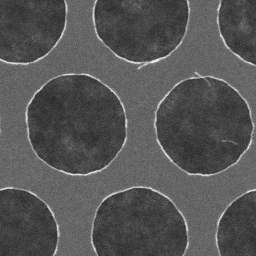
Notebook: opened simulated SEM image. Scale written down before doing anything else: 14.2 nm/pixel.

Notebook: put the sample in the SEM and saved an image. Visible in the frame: holes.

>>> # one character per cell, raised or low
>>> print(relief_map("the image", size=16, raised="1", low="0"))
0000110000001100
0000110000001100
0000110000011100
0001111000111110
1111111111111111
1110000111100001
1100000011000001
1100000011000000
1100000011000000
1100000111000001
1110001111100011
1111111111111111
0001111000011110
0001110000011100
0000110000001100
0000110000001100